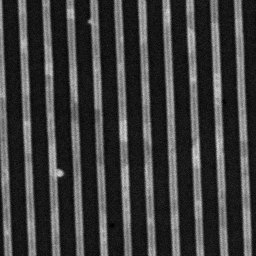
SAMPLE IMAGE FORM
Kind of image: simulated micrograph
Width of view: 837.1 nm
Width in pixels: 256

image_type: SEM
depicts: parallel lines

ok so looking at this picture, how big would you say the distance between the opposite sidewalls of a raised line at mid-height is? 0.0171 um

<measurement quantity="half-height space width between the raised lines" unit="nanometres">60.4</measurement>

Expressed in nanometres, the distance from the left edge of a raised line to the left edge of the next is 78.4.